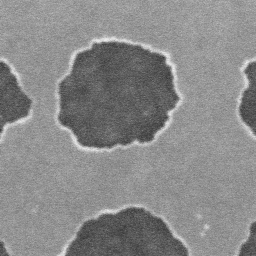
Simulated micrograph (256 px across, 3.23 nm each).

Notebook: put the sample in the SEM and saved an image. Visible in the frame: holes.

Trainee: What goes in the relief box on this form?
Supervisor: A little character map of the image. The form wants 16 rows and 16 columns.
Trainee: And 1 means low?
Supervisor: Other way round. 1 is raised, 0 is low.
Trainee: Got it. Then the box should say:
1111111111111111
1111111111111111
1111111111111111
1111100000111111
0111000000011110
0111000000011110
0011000000011110
0111000000111110
1111100000111111
1111111111111111
1111111111111111
1111111111111111
1111111111111111
1111110000111111
1111100000011111
1111000000001110